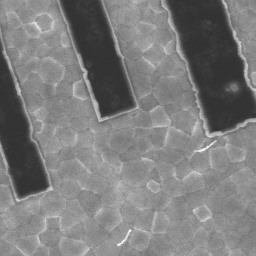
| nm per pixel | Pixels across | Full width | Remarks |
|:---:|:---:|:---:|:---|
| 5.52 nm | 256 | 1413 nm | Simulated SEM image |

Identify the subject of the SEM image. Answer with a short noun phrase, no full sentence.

one or a few lines or trenches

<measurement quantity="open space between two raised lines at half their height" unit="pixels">58.3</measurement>